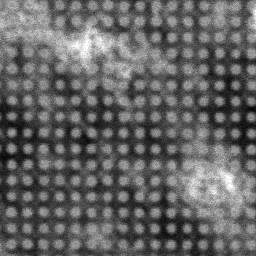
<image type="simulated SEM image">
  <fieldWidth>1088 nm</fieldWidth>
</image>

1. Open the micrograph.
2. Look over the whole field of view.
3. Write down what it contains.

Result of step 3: a regular array of raised bodies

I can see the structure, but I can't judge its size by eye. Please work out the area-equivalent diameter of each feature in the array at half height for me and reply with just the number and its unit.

0.036 microns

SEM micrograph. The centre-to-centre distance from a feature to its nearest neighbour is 66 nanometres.